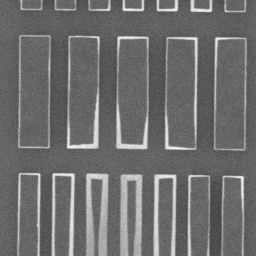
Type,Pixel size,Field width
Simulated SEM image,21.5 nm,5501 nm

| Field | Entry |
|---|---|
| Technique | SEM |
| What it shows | groups of lines, slits or small figures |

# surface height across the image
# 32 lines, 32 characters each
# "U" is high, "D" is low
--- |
DDDUUDDUUDDUUUDDUUDDUUDDUUDDUUUD
DDDDDDDDDDDDDDDDDDDDDDDDDDDDDDDD
DDDDDDDDDDDDDDDDDDDDDDDDDDDDDDDD
DDDDDDDDDDDDDDDDDDDDDDDDDDDDDDDD
DDDUUDDDDDDDDDDDDDDDDDDDDDDDDDDD
DDDUUUDDDUUUDDDUUUDDDUUUDDDUUUUD
DDDUUUDDDUUUDDDUUUDDDUUUDDDUUUUD
DDUUUUDDDUUUDDDUUUDDDUUUDDDUUUUD
DDDUUUDDDUUUDDDUUUDDDUUUDDDUUUUD
DDDUUUDDDUUUDDDUUUDDDUUUDDDUUUUD
DDUUUUDDDUUUDDDUUUDDDUUUDDDUUUUD
DDUUUUDDDUUUDDDUUUDDDUUUDDDUUUUD
DDUUUUDDDUUUDDDUUUDDDUUUDDDUUUUD
DDUUUUDDDUUUDDDUUUDDDUUUDDDUUUUD
DDUUUUDDDUUUDDDUUUDDDUUUDDDUUUUD
DDUUUUDDDUUUDDDUUUDDDUUUDDDUUUUD
DDUUUUDDDUUUDDDUUUDDDUUUDDDUUUUD
DDUUUUDDDUUUDDDUUUDDDUUUDDDUUUUD
DDDDDDDDDDDDDDDDDDDDDUUUDDDUUUDD
DDDDDDDDDDDDDDDDDDDDDDDDDDDDDDDD
DDDDDDDDDDDDDDDDDDDDDDDDDDDDDDDD
DDDDDDDDDDDDDDDDDDDDDDDDDDDDDDDD
DDUUUDDUUDDUUDDDUDDDUUDDUUDDUUDD
DDUUUDDUUDDUUDDDUDDDUUDDUUDDUUDD
DDUUUDDUUDDUUDDDUDDDUUDDUUDDUUDD
DDUUUDDUUDDUUDDDUDDDUUDDUUDDUUDD
DDUUUDDUUDDUUDDDUDDDUUDDUUDDUUDD
DDUUUDDUUDDUUDDDUDDDUUDDUUDDUUDD
DDUUUDDUUDDUUDDDUDDDUUDDUUDDUUDD
DDUUUDDUUDDUUDDDUDDDUUDDUUDDUUDD
DDUUUDDUUDDUUDDDUDDDUUDDUUDDUUDD
DDUUUDDUUDDUUDDDUDDDUUDDUUDDUUDD